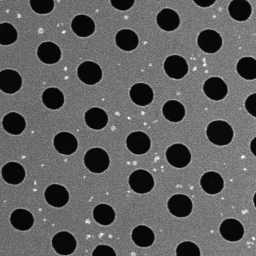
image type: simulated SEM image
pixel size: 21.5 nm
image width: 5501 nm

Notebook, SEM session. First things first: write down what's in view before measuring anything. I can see a regular array of holes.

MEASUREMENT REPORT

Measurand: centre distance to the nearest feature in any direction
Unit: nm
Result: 925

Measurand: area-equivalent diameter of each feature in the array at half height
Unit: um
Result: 0.512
